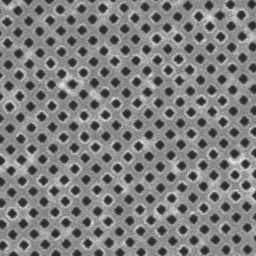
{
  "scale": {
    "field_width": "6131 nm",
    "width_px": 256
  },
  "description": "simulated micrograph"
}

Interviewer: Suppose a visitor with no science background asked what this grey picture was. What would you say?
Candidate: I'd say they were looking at a regular array of holes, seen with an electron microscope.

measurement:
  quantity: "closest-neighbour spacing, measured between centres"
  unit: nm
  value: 355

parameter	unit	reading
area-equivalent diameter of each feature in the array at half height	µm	0.229